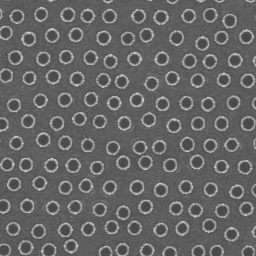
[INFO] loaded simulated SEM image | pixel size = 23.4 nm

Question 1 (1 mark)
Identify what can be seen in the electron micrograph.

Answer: a regular array of raised bodies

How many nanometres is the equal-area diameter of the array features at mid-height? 295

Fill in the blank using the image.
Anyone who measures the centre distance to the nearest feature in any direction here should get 498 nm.